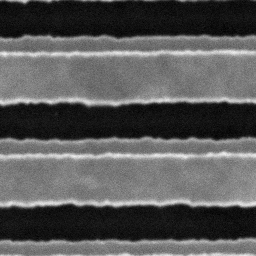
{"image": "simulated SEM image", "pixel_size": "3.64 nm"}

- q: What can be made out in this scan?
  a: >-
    lines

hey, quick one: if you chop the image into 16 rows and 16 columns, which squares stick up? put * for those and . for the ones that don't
................
................
****************
****************
****************
****************
*.....**........
................
................
****************
****************
****************
****************
................
................
****************